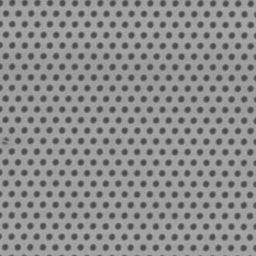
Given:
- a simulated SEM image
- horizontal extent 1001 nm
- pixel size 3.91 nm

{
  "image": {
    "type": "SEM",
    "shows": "a regular array of holes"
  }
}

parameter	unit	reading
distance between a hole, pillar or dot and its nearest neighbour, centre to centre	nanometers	47.3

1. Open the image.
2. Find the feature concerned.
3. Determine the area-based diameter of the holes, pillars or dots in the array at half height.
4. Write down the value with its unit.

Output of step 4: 0.0254 µm